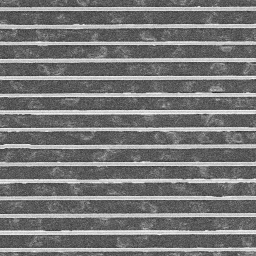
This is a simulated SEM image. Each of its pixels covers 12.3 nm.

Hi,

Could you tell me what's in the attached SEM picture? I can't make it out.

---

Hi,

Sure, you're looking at parallel lines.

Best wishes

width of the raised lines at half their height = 44.7 nm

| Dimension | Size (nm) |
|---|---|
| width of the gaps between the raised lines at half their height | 170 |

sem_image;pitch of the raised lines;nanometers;212